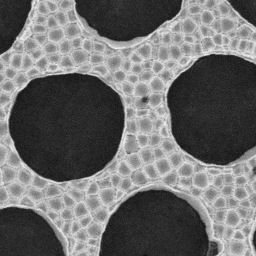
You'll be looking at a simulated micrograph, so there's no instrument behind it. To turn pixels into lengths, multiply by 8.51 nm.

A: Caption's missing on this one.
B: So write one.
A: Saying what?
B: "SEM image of holes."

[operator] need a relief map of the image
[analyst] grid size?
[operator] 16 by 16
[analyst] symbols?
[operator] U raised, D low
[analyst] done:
DDUUUDDDDDDUUUUD
DDUUUDDDDDUUUUUU
DUUUUUUDUUUUUUUU
UUUUUUUUUUUUUDDU
UUUUUUUUUUUDDDDD
UDDDDDDUUUUDDDDD
UDDDDDDDUUDDDDDD
UDDDDDDDUUUDDDDD
UDDDDDDDUUUDDDDD
UDDDDDDUUUUUDDDD
UUDDDDDUUUUUUUUU
UUUUUUUUUUUUUUUU
UUUUUUUUDDDDUUUU
DDDUUUUDDDDDDUUU
DDDDUUDDDDDDDUUU
DDDDUUDDDDDDDDUU